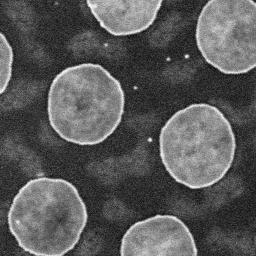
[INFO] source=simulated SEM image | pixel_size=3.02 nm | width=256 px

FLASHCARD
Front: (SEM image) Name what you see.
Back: raised bodies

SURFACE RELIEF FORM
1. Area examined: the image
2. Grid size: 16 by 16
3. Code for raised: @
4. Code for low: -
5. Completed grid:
------@@@@---@@@
------@@@---@@@@
------------@@@@
@------------@@@
@---@@@-------@-
---@@@@@--------
---@@@@@--------
---@@@@----@@@--
----@@@---@@@@@-
----------@@@@@-
----------@@@@--
--@@--------@---
-@@@@-----------
-@@@@-----------
-@@@@---@@@@----
--@@----@@@@----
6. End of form